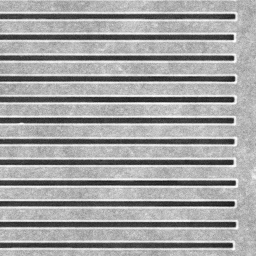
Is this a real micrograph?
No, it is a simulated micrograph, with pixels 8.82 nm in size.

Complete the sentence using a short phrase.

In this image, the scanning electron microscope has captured parallel lines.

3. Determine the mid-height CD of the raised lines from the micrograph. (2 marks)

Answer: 132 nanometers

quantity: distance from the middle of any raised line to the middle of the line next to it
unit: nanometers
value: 184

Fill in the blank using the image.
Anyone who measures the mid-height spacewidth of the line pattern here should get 0.0496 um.